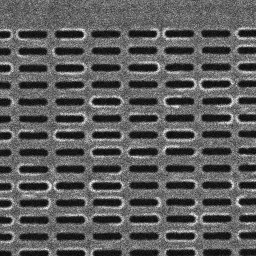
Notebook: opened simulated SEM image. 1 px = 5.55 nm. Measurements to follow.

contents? a regular array of holes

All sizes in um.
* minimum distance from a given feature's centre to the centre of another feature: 0.0927